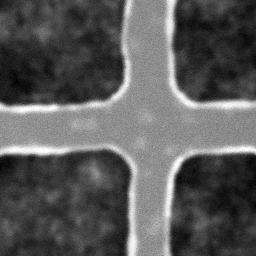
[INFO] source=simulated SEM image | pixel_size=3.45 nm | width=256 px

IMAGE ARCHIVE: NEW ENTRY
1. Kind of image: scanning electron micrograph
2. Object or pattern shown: holes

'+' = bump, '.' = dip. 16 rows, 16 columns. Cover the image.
........+++.....
........+++.....
........+++.....
........+++.....
........+++.....
........+++.....
.....++++++++.++
++++++++++++++++
++++++++++++++++
++++...+++++++++
........+++.....
........+++.....
........+++.....
........+++.....
........+++.....
........+++.....